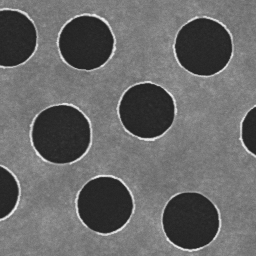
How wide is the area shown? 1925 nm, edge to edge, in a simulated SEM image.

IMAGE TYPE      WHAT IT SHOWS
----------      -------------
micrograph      holes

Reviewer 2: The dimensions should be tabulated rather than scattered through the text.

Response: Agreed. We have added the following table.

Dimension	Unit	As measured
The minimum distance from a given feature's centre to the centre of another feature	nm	639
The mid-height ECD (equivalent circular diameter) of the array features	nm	421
